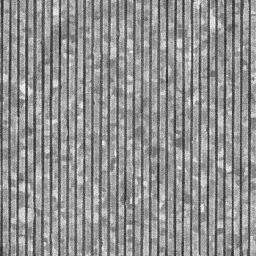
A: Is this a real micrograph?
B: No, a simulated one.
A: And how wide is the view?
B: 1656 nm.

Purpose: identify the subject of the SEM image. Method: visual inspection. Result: parallel lines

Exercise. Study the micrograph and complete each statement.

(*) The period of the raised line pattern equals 53.4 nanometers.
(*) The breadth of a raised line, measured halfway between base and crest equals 35.6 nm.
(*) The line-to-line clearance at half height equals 17.8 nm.